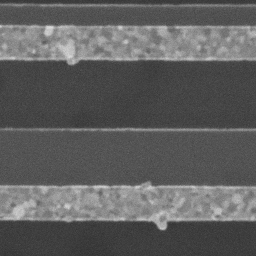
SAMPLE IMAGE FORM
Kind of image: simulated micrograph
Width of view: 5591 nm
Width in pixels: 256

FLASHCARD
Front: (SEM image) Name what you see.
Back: lines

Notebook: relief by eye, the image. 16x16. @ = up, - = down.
@@@@@@@@@@@@@@@@
@@@@@@@@@@@@@@@@
@@@@@@@@@@@@@@@@
@@@@@@@@@@@@@@@@
----------------
----------------
----------------
----------------
@@@@@@@@@@@@@@@@
@@@@@@@@@@@@@@@@
@@@@@@@@@@@@@@@@
@@@@@@@@@@@@@@@@
@@@@@@@@@@@@@@@@
@@@@@@@@@@@@@@@@
----------------
----------------